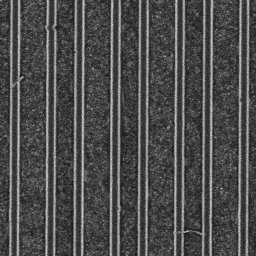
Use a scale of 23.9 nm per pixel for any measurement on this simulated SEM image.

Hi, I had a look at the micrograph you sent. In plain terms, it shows parallel lines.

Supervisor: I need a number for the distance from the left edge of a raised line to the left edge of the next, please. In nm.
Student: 781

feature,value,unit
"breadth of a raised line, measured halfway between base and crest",189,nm